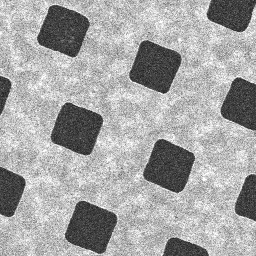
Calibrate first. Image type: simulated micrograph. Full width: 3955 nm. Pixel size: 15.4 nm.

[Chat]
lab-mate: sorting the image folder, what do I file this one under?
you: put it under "holes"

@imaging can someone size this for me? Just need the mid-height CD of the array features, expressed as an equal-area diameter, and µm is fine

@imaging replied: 0.757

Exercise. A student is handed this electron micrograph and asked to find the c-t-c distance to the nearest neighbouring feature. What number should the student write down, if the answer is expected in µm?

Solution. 1.53